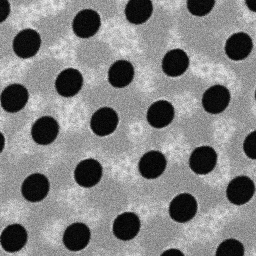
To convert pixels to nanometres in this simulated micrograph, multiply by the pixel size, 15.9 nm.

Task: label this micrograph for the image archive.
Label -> a regular array of holes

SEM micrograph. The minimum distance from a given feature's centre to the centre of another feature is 0.832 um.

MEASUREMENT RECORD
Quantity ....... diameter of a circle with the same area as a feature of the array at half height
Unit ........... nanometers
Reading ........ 463